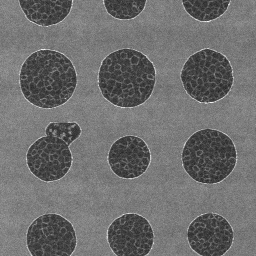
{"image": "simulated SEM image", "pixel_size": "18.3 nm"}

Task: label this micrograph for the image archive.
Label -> raised bodies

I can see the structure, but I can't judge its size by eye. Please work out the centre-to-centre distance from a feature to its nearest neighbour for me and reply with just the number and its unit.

1420 nanometres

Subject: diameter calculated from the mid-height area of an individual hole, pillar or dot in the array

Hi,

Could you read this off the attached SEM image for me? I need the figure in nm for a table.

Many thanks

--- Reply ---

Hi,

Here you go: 985